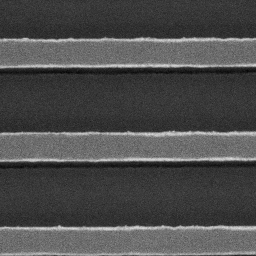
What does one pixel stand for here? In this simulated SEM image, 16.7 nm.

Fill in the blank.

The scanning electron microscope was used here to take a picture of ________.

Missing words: lines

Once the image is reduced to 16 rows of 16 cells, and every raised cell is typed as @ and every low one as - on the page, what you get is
----------------
----------------
@@@@@@@@@@@@@@@@
@@@@@@@@@@@@@@@@
----------------
----------------
----------------
----------------
@@@@@@@@@@@@@@@@
@@@@@@@@@@@@@@@@
----------------
----------------
----------------
----------------
@@@@@@@@@@@@@@@@
@@@@@@@@@@@@@@@@